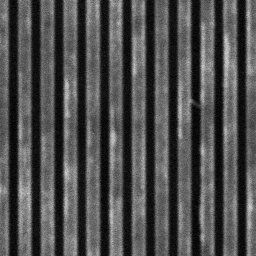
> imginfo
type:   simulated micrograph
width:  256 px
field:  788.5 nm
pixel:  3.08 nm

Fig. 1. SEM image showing parallel lines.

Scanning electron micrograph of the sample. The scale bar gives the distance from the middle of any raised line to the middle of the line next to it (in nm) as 70.3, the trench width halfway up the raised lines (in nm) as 34.2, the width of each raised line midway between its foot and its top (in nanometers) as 36.9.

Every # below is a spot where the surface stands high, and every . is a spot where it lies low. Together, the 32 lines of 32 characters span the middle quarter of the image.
###...###...##...###...###...##.
###...###...##...###...###...##.
###...###...##...###...###...##.
###...###...##...###...###...##.
###...###...##...###...###...##.
###...###...##...###...###...##.
###...###...##...###...###...##.
###...###...##...###...###...##.
###...###...##...###...###...###
###...###...##...###...###...###
###...###...##...###...###...##.
###...###...##...###...###...##.
###...###...##...###...###...##.
###...###...##...###...###...##.
###...###...##...###...###...##.
###...###...##...###...###...##.
###...###...##...###...###...##.
###...###...##...###...###...##.
###...###...##...###...###...##.
###...###...##...###...###...##.
###...###...##...###...###...##.
###...###...##...###...###...##.
###...###...##...###...###...##.
###...###...##...###...###...##.
###...###...##...###...###...##.
###...###...##...###...###...##.
###...###...##...###...###...##.
###...###...##...###...###...##.
###...###...##...###...###...##.
###...###...##...###...###...##.
###...###...##...###...###...##.
###...###...##...###...###...##.